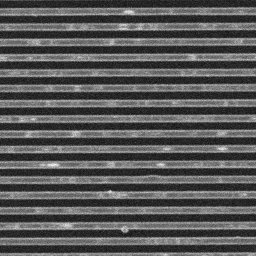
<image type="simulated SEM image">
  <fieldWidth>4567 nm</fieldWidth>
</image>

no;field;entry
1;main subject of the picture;parallel lines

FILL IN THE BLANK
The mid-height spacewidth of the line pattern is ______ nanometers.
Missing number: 154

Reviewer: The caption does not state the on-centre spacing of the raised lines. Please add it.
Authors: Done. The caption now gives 273 nanometers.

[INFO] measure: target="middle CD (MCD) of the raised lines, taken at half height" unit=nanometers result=123